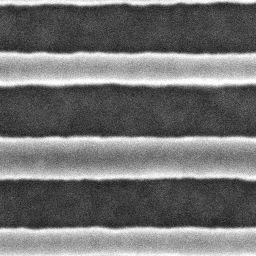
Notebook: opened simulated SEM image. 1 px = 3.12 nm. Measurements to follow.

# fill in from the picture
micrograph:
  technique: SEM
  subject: lines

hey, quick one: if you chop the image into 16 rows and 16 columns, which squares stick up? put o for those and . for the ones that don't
................
................
................
oooooooooooooooo
oooooooooooooooo
................
................
................
................
oooooooooooooooo
oooooooooooooooo
................
................
................
oooooooooooooooo
oooooooooooooooo